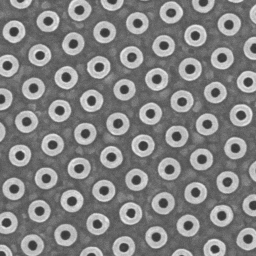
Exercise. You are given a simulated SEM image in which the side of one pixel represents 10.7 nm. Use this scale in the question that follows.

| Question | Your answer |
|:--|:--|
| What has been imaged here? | a regular array of ring-shaped raised bodies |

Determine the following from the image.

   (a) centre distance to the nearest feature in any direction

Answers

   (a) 357 nanometres